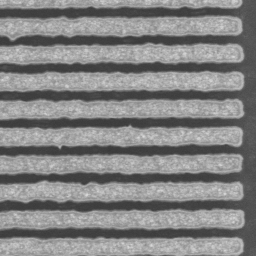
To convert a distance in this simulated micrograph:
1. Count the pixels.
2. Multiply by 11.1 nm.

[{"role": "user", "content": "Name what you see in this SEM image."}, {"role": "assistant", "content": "parallel lines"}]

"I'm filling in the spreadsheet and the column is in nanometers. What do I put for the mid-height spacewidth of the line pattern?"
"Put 114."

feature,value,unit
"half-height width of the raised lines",190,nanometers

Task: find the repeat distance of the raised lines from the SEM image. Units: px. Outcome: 27.6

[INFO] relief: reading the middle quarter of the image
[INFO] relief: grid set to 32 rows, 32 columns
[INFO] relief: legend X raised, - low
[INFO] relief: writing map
--------------------------------
--------------------------------
XXXXXXXXXXXXXXX-XX-XXXXXXXXXXXXX
XXXXXXXXXXXXXXXXXXXXXXXXXXXXXXXX
XXXXXXXXXXXXXXXXXXXXXXXXXXXXXXXX
XXXXXXXXXXXXXXXXXXXXXXXXXXXXXXXX
-XXXXXXXXXX----------XXX--X-----
--------------------------------
--------------------------------
XXXXX--XXXXXX-XXXXXXXXXXXXXXXXXX
XXXXXXXXXXXXXXXXXXXXXXXXXXXXXXXX
XXXXXXXXXXXXXXXXXXXXXXXXXXXXXXXX
XXXXXXXXXXXXXXXXXXXXXXXXXXXXXXXX
-XXX--X---X--X-----X------------
--------------------------------
----------------X---------------
XXXXXXXXXXXXXXXXXXX-XXXXXXXXXXXX
XXXXXXXXXXXXXXXXXXXXXXXXXXXXXXXX
XXXXXXXXXXXXXXXXXXXXXXXXXXXXXXXX
XXXXXXXXXXXXXXXXXXXXXXXXXXXXXXXX
--------------XX-----------X----
--------------------------------
--------------------------------
XXXXXXXXXXXXXXXXXXXXXXXXXXXXXXXX
XXXXXXXXXXXXXXXXXXXXXXXXXXXXXXXX
XXXXXXXXXXXXXXXXXXXXXXXXXXXXXXXX
XXXXXXXXXXXXXXXXXXXXXXXXXXXXXXXX
----------------X---------------
--------------------------------
--------------------------------
XXXXXXXXXXXXXXXXXXXXXXXXXXXXXXXX
XXXXXXXXXXXXXXXXXXXXXXXXXXXXXXXX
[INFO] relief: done